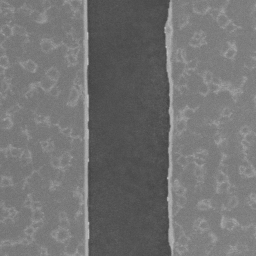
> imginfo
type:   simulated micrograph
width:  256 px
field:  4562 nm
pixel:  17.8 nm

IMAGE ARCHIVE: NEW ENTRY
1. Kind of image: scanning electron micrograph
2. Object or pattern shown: one or a few lines or trenches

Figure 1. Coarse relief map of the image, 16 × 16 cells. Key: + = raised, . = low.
+++++......+++++
+++++......+++++
+++++......+++++
+++++......+++++
+++++......+++++
+++++......+++++
+++++......+++++
+++++......+++++
+++++......+++++
+++++......+++++
+++++......+++++
+++++......+++++
+++++......+++++
+++++......+++++
+++++......+++++
+++++......+++++